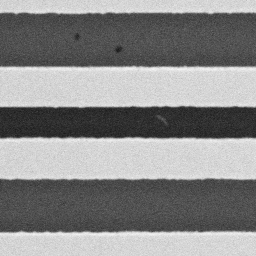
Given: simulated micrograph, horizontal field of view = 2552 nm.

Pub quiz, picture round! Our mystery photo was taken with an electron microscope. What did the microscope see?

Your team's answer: lines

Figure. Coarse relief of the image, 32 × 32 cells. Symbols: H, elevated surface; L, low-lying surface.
HHHHHHHHHHHHHHHHHHHHHHHHHHHHHHHH
LHHHHHLHHHHHHLHHHLLLLHHLLLHLHLLL
LLLLLLLLLLLLLLLLLLLLLLLLLLLLLLLL
LLLLLLLLLLLLLLLLLLLLLLLLLLLLLLLL
LLLLLLLLLLLLLLLLLLLLLLLLLLLLLLLL
LLLLLLLLLLLLLLLLLLLLLLLLLLLLLLLL
LLLLLLLLLLLLLLLLLLLLLLLLLLLLLLLL
LLLLLLLLLLLLLLLLLLLLLLLLLLLLLLLL
HHHHHHHHHHHHHHHHHHHHHHHHHHHHHHHH
HHHHHHHHHHHHHHHHHHHHHHHHHHHHHHHH
HHHHHHHHHHHHHHHHHHHHHHHHHHHHHHHH
HHHHHHHHHHHHHHHHHHHHHHHHHHHHHHHH
HHHHHHHHHHHHHHHHHHHHHHHHHHHHHHHH
LLLLLLLLLLLLLLLLLLLLLLLLLLLLLLLL
LLLLLLLLLLLLLLLLLLLLLLLLLLLLLLLL
LLLLLLLLLLLLLLLLLLLLLLLLLLLLLLLL
LLLLLLLLLLLLLLLLLLLLLLLLLLLLLLLL
HHHHHHHHHHHHHHHHHHHHHHHHHHHHHHHH
HHHHHHHHHHHHHHHHHHHHHHHHHHHHHHHH
HHHHHHHHHHHHHHHHHHHHHHHHHHHHHHHH
HHHHHHHHHHHHHHHHHHHHHHHHHHHHHHHH
HHHHHHHHHHHHHHHHHHHHHHHHHHHHHHHH
LLLLLLLLLLLLLLLLLLLLLLLLLLLLLLLL
LLLLLLLLLLLLLLLLLLLLLLLLLLLLLLLL
LLLLLLLLLLLLLLLLLLLLLLLLLLLLLLLL
LLLLLLLLLLLLLLLLLLLLLLLLLLLLLLLL
LLLLLLLLLLLLLLLLLLLLLLLLLLLLLLLL
LLLLLLLLLLLLLLLLLLLLLLLLLLLLLLLL
LLLLLLLLLLLLLLLLLLLLLLLLLLLLLLLL
HHHHHHHHHHHHHHHHHHHHHHHHHHHHHHHH
HHHHHHHHHHHHHHHHHHHHHHHHHHHHHHHH
HHHHHHHHHHHHHHHHHHHHHHHHHHHHHHHH